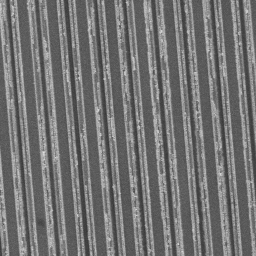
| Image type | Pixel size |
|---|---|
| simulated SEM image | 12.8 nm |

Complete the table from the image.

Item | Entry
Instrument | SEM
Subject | parallel lines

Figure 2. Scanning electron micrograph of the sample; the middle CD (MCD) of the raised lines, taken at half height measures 6.1 px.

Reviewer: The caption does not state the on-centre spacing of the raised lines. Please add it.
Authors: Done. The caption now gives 0.184 um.